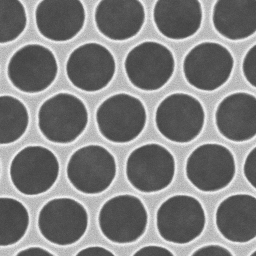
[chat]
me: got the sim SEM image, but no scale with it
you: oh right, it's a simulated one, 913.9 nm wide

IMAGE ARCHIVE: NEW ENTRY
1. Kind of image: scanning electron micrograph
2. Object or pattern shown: a regular array of holes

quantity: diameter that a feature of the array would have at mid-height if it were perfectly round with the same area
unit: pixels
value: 48.6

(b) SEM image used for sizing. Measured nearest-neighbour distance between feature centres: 208 nanometres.